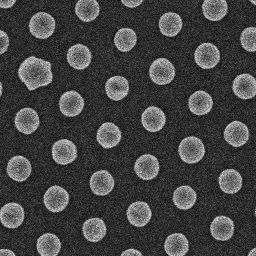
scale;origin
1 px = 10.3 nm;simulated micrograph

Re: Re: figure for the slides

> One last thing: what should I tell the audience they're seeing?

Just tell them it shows a regular array of raised bodies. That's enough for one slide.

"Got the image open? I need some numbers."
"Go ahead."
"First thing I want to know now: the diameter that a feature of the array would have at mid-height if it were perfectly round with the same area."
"249 nm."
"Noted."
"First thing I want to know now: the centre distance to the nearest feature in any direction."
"490 nanometres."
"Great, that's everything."